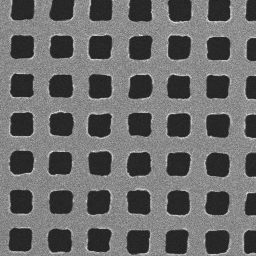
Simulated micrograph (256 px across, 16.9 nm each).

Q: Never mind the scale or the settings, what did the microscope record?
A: a regular array of holes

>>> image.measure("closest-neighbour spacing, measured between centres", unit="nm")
646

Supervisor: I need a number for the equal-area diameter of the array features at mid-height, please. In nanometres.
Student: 428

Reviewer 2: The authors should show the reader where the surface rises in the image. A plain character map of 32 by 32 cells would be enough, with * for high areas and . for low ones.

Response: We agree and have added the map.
*...**...**...**...**...**...**.
*...**...**...**...**...**...**.
**..***.****.***...***..**..***.
********************************
**..***.****..***..**..*********
*...**...**...**...**...**...**.
*...**...**...**...**...**...**.
***************************.***.
********************************
**..***..**..****..***.***.****.
*...**...**...**...**...**...**.
*...**...**...**...**...**...**.
********************************
********************************
*...**...**...**...**...**...**.
*...**...**...**...**...**...**.
*...**...**...**...**...**...**.
********************************
********************************
*...**...**...**...**...**..***.
*...**...**...**...**...**...**.
**..**...**...**...**..***...**.
********************************
********************************
*...**...**...**...**...**...**.
*...**...**...**...**...**...**.
**..**...**..***...**...**..***.
********************************
**.*****************************
*...**...**...**...**...**...**.
*...**...**...**...**..***...*..
*******.********..***..***..***.